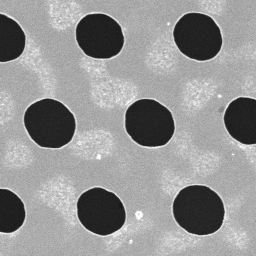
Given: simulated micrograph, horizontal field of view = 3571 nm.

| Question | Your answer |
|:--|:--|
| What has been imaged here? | holes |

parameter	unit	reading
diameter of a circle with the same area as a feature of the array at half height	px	48.6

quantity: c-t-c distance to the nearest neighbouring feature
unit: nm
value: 1370